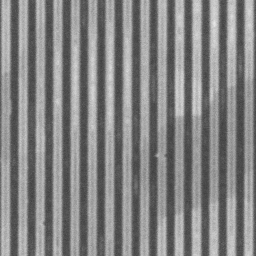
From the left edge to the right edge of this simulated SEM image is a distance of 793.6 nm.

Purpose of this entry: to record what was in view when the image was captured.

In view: parallel lines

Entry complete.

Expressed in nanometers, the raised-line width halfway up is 25.6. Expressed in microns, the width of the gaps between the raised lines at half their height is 0.0283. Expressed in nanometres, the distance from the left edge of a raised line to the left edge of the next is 53.9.